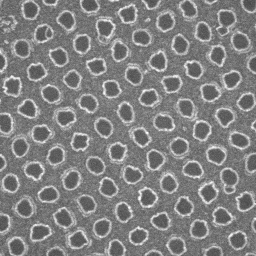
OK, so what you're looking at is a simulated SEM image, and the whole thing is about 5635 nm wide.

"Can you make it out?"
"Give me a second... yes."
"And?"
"a regular array of raised bodies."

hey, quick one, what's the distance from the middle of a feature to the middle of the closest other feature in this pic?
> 577 nm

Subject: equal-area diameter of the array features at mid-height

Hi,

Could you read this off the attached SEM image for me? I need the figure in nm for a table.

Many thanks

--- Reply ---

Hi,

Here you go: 386